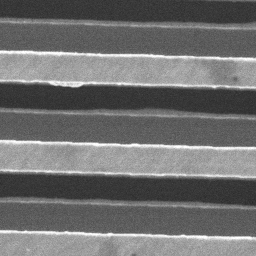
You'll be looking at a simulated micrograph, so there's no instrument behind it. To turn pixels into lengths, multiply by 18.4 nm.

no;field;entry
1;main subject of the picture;lines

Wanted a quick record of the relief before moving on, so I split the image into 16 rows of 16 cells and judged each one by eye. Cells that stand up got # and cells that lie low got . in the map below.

................
#######.........
################
################
################
................
................
################
################
################
################
................
................
################
################
################